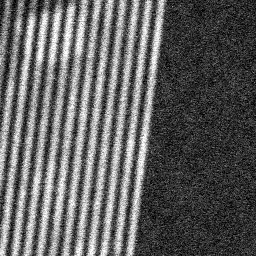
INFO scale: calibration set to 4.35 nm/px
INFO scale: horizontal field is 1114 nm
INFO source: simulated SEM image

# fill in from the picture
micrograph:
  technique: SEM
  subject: parallel lines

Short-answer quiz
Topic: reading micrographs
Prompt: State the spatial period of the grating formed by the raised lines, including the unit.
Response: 55 nanometers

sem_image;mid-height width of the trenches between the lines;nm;33.4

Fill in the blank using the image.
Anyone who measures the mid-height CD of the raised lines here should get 21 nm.